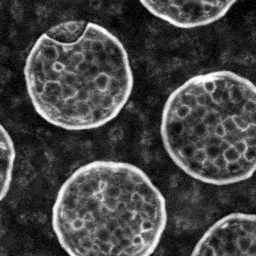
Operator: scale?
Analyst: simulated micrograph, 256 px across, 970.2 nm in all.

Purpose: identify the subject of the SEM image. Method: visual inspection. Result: raised bodies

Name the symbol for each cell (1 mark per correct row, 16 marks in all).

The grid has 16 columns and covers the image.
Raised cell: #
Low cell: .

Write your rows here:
.........#####..
...........#....
.....##.........
..######........
..######........
..######...#####
..######...#####
...####...######
..........######
#..........#####
#....###....####
....#####.......
....######......
...#######......
....######...###
....#####...####